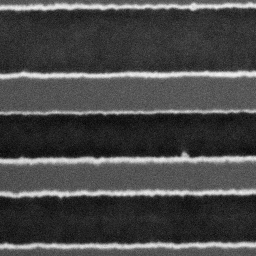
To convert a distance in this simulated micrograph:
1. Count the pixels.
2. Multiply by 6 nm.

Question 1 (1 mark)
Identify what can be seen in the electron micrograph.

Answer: lines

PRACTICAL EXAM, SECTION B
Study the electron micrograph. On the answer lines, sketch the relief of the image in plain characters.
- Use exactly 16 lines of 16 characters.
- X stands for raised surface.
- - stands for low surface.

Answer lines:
XXXXXXXXX--XX---
----------------
----------------
----------------
----------------
XXXXXXXXXXXXXXXX
XXXXXXXXXXXXXXXX
----------------
----------------
----------------
XXXXXXXXXXXXXXXX
XXXXXXXXXXXXXXXX
----------------
----------------
----------------
XXXXXXXXXXXXXXXX